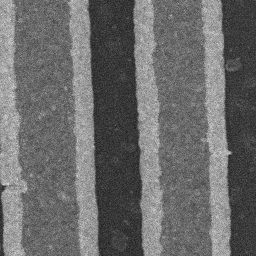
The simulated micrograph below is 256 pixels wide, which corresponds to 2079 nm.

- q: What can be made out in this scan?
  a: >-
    one or a few lines or trenches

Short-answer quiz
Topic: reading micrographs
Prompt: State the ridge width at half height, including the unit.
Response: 566 nm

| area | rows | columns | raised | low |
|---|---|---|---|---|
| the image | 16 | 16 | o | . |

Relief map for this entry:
ooooo....oooo...
ooooo....oooo...
ooooo....oooo...
ooooo....oooo...
ooooo....oooo...
ooooo....oooo...
ooooo....oooo...
.oooo....oooo...
.oooo....ooooo..
.oooo....ooooo..
.oooo....ooooo..
.oooo....ooooo..
.oooo.....oooo..
.oooo....ooooo..
.ooooo...ooooo..
.ooooo....oooo..